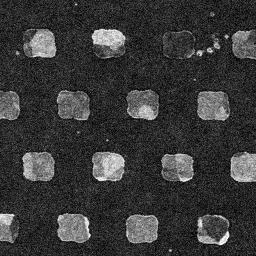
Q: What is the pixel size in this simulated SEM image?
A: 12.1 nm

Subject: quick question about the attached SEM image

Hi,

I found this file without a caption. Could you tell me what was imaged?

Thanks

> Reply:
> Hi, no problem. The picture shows a regular array of raised bodies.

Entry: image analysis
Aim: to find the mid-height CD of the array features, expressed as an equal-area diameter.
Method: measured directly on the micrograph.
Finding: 0.379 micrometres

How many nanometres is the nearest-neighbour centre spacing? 838